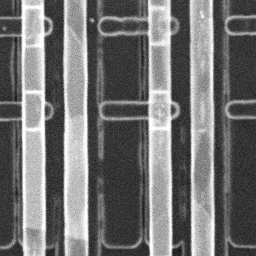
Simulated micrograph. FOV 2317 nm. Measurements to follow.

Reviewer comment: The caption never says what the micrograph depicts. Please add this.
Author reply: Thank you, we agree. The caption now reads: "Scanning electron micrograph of wiring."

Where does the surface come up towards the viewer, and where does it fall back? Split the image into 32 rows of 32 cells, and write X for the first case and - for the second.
---XX---XXX--------XX---XX------
---XX---XXX--------XX---XX------
XXXXXX--XXX--XXXX-XXXX--XX---XXX
XXXXXX--XXX-XXXXXXXXXX--XX--XXXX
--XXXX--XXX--------XX---XX------
---XX---XXX--------XX---XX------
---XX---XXX--------XX---XX------
---XX---XXX--------XX---XX------
---XX---XXX--------XX---XX------
---XX---XXX--------XX---XX------
---XXX--XXX--------XX---XX------
---XXX--XXX--------XX---XX------
---XXX--XXX--------XX---XX------
XXXXXX--XXX--XXXXXXXXX--XX--XXXX
XXXXXX--XXX--XXXXXXXXX--XX---XXX
---XX---XXX--------XX---XX------
---XX---XXX--------XX---XXX-----
---XX---XXX--------XX---XXX-----
---XXX--XXX--------XX---XXX-----
---XXX--XXX--------XX---XXX-----
---XXX--XXX--------XX---XXX-----
---XXX--XXX--------XX---XXX-----
---XXX--XXX--------XX---XXX-----
---XXX--XXX--------XX---XXX-----
---XXX--XXX--------XX---XXX-----
---XXX--XXX--------XX---XXX-----
---XXX--XXX--------XX---XXX-----
---XXX--XXX--------XX---XXX-----
---XXX--XXX--------XX---XXX-----
---XXX--XXX--------XX---XXX-----
---XX---XXX--------XX---XXX-----
---XX---XXX--------XX---XXX-----